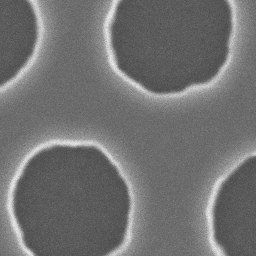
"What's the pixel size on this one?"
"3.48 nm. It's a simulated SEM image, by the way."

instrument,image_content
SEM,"holes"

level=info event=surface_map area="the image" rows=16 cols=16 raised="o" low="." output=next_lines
..ooooo.......oo
..ooooo........o
..ooooo.......oo
..ooooo.......oo
.ooooooo......oo
ooooooooo...oooo
oooooooooooooooo
oooooooooooooooo
oooooooooooooooo
oo....oooooooooo
o......oooooooo.
o.......oooooo..
o.......ooooo...
o.......ooooo...
o.......ooooo...
oo.....ooooooo..